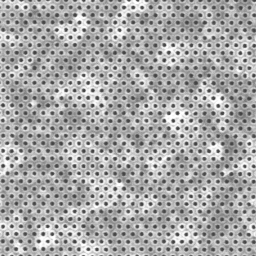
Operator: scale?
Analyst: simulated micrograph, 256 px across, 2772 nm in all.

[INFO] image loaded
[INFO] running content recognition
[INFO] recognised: a regular array of holes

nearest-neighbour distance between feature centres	91.9	nm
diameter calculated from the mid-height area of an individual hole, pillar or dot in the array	51.8	nm